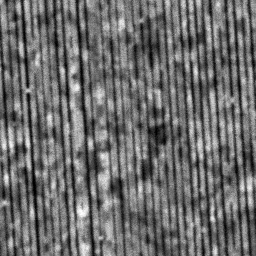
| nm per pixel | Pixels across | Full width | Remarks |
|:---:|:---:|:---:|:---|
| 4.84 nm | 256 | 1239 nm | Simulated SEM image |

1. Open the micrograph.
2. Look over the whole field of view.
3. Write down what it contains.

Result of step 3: parallel lines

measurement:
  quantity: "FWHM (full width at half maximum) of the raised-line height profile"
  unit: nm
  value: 23.6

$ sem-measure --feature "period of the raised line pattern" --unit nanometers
37.9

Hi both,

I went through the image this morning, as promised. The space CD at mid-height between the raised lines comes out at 0.0139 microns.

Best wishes